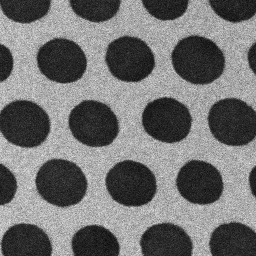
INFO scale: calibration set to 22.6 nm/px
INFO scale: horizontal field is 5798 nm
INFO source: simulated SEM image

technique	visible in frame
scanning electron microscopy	a regular array of holes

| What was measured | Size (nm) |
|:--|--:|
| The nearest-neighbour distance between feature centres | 1530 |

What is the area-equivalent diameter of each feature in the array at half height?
1100 nm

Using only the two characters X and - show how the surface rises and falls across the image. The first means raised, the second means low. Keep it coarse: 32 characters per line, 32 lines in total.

------XXX------XXX------XX------
------XXX------XXXX----XXXX-----
X----XXXXXX--XXXXXXX--XXXXXX---X
XXXXXXXXXXXXXXXXXXXXXXXXXXXXXXXX
XXXXXXXXXXXXXXXXXXXXXXX--XXXXXXX
XXXXXX----XXXX----XXXX-----XXXXX
-XXXX------XX------XX-------XXX-
--XXX------XX------XX-------XXX-
--XXX------XX------XXX------XXX-
-XXXXX----XXXX-----XXX-----XXXXX
XXXXXXXXXXXXXXXXXXXXXXXX--XXXXXX
XXXXXXXXXXXXXXXXXXXXXXXXXXXXXXXX
XX-XXXXXXXXXXXXXXXX---XXXXXX--XX
-----XXXX-----XXXX-----XXX------
------XXX------XXX------XX------
------XXX------XXX------XX------
------XXX------XXX------XX------
X-----XXXX----XXXXXX---XXXX-----
XXX-XXXXXXXXXXXXXXXXXXXXXXXXXXXX
XXXXXXXXXXXXXXXXXXXXXXXXXXXXXXXX
XXXXX----XXXXX----XXXXX---XXXXXX
-XXXX-----XXX------XXX-----XXXX-
--XX-------XX------XXX------XXX-
--XXX------XX-------XX------XXX-
--XXX------XXX-----XXXX-----XXXX
-XXXXX---XXXXXX---XXXXXX--XXXXXX
XXXXXXXXXXXXXXXXXXXXXXXXXXXXXXXX
XXXXXXXXXXXXXXXXXXXXXXXXXXXXXXXX
X----XXXXX---XXXXXX----XXXX----X
------XXX-----XXXX------XX------
------XXX------XXX------XX------
------XXX------XXX------XX------